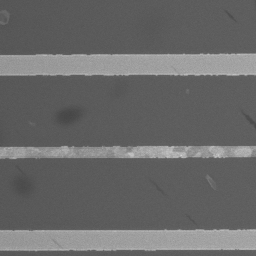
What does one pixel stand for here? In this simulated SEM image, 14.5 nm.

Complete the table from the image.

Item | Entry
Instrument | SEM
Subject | lines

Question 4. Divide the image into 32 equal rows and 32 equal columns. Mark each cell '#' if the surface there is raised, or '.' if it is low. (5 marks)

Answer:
................................
#...............................
#...............................
................................
................................
................................
................................
################################
################################
................................
................................
................................
................................
................................
................................
................................
................................
................................
########################.#######
################################
................................
................................
................................
................................
................................
................................
................................
................................
................................
################################
################################
................................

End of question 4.